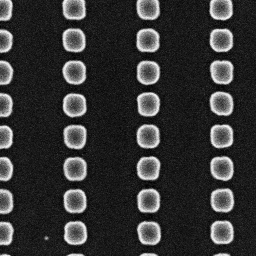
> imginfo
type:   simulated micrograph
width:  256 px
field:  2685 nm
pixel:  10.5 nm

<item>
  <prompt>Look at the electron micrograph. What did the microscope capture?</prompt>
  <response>a regular array of raised bodies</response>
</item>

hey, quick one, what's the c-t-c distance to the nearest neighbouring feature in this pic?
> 335 nanometres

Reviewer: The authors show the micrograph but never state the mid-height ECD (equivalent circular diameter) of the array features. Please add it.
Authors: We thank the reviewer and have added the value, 238 nanometers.